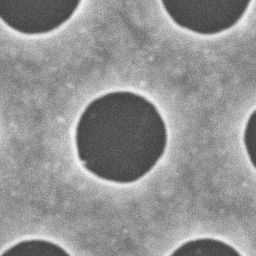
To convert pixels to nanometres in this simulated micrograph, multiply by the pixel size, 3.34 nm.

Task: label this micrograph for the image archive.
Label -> holes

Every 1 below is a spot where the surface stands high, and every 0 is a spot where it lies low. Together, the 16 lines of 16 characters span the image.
0000011111000000
0000111111100001
1111111111111111
1111111111111111
1111111111111111
1111111111111111
1111110000111111
1111100000111110
1111100000111110
1111100000111110
1111100000111111
1111111011111111
1111111111111111
1111111111111111
1111111111111111
1000111111100001